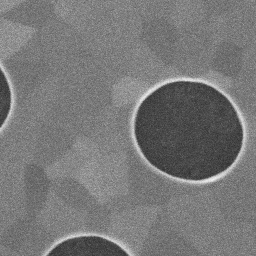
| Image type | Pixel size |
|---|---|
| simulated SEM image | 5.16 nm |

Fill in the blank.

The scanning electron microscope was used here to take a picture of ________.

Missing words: holes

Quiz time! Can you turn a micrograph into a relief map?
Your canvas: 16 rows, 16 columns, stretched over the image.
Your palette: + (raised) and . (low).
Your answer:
++++++++++++++++
++++++++++++++++
++++++++++++++++
++++++++++++++++
++++++++++++++++
.+++++++++...+++
.++++++++.....++
++++++++.......+
++++++++.......+
+++++++++......+
++++++++++....++
++++++++++++++++
++++++++++++++++
++++++++++++++++
++++++++++++++++
+++.....++++++++